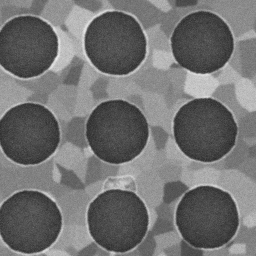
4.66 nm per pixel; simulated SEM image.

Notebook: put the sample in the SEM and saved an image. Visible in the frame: holes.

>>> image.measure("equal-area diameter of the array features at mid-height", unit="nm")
300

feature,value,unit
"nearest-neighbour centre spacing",406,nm